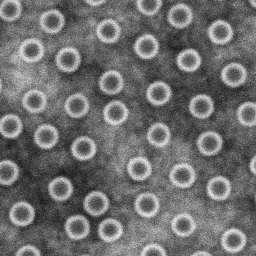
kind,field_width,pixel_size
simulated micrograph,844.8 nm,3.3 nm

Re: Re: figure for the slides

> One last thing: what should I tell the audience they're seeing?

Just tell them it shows a regular array of raised bodies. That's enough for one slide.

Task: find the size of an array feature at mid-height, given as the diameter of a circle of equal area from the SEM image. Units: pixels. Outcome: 22.4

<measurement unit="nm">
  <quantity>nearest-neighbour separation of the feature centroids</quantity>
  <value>128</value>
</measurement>